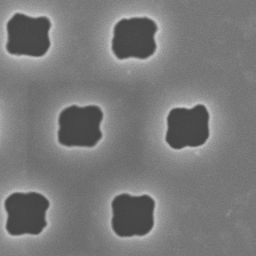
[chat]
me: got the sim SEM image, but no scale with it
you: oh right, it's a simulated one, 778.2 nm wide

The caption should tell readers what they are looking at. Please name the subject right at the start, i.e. holes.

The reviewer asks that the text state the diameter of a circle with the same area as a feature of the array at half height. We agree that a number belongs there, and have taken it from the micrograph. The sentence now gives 137 nanometers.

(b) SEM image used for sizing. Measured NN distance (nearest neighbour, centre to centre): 314 nm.